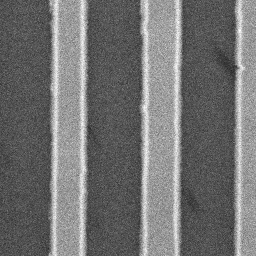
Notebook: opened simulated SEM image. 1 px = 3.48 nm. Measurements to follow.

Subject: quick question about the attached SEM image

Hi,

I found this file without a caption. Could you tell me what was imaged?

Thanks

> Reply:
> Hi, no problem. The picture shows one or a few lines or trenches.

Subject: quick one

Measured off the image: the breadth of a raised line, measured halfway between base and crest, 99.5 nm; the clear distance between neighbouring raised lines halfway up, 220 nanometers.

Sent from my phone